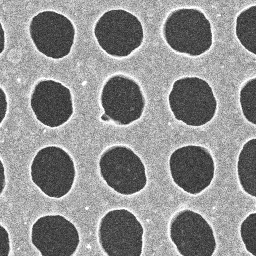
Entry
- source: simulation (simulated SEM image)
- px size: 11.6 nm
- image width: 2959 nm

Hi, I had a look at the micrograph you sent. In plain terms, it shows a regular array of holes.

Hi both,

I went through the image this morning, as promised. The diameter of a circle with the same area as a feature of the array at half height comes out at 0.54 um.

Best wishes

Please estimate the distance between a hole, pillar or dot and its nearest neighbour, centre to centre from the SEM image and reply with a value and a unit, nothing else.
68.2 px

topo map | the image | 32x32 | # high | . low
################################
#####..######...######...#####..
####.....###.....####.....####..
####.....###......##......###...
.###.....###......###......###..
.###.....###......###.....####..
#####....####...#######...#####.
################################
################################
################################
#####...#####....#####....#####.
####.....####.....###......###..
.###.....####.....###......###..
.###.....####.....###......###..
.###.....####.....####.....####.
#####...#######.#######...######
################################
###############################.
######.#######..#######..#####..
####.....####....####.....####..
####.....###......###......###..
.###.....####.....###......###..
.###.....####.....####....####..
#####....#####....#####...####..
######..########################
################################
##############..#######.########
#####...#####....#####....#####.
####.....###......###.....####..
.###......##......###......###..
.###......###.....####.....###..
.####....####.....####.....####.